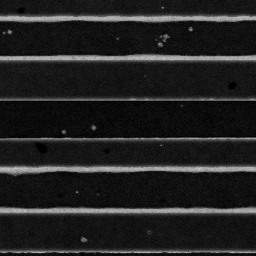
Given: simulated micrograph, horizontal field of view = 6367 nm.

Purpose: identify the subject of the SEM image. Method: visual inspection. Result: lines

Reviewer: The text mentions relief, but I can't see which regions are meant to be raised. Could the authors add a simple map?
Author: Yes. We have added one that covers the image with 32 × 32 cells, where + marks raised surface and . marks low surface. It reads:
++++++++++++++++++++++++++++++++
++++++++++++++++++++++++++++++++
................................
................................
................................
................................
................................
++++++++++++++++++++++++++++++++
++++++++++++++++++++++++++++++++
++++++++++++++++++++++++++++++++
++++++++++++++++++++++++++++++++
++++++++++++++++++++++++++++++++
................................
................................
................................
................................
................................
++++++++++++++++++++++++++++++++
++++++++++++++++++++++++++++++++
++++++++++++++++++++++++++++++++
++++++++++++++++++++++++++++++++
................................
................................
................................
................................
................................
++++++++++++++++++++++++++++++++
++++++++++++++++++++++++++++++++
++++++++++++++++++++++++++++++++
++++++++++++++++++++++++++++++++
++++++++++++++++++++++++++++++++
...............+..+....+......++